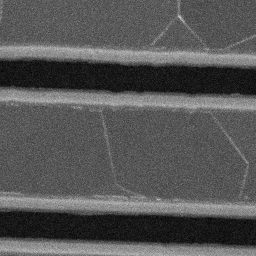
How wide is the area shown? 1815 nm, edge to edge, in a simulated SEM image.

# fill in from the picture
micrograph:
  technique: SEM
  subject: one or a few lines or trenches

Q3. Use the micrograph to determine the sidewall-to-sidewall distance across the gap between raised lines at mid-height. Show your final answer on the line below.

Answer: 318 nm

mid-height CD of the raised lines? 0.749 micrometres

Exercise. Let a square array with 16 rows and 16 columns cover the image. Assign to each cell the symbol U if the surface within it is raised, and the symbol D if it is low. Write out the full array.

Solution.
UUUUUUUUUUUUUUUU
UUUUUUUUUUUUUUUU
UUUUUUUUUUUUUUUU
DDDDDDDDUUUUUUUU
DDDDDDDDDDDDDDDD
DDDDDDDDDDDDDDDD
UUUUUUUUUUUUUUDD
UUUUUUUUUUUUUUUU
UUUUUUUUUUUUUUUU
UUUUUUUUUUUUUUUU
UUUUUUUUUUUUUUUU
UUUUUUUUUUUUUUUU
UUUUUUUUUUUUUUUU
DDDDDDDDDDDDDDDD
DDDDDDDDDDDDDDDD
UUDDDDDDDDDDDDDD